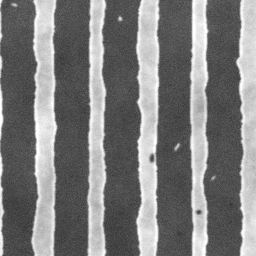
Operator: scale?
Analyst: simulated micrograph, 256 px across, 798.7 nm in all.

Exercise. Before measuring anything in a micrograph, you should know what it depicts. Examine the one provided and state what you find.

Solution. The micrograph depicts lines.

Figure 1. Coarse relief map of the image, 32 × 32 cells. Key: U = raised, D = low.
DDDDUUUDDDDUUDDDDDUUDDDDUUDDDDUU
DDDDDUUDDDDUUDDDDUUUDDDDUUDDDDUU
DDDDUUUDDDDUUDDDDUUUDDDDUUDDDDUU
DDDDUUUDDDDUUDDDDUUUDDDDUUDDDDUU
DDDDUUUDDDDUUDDDDUUUDDDDUUDDDDUU
DDDDUUUDDDDUUDDDDUUUDDDDUUDDDDUU
DDDDUUUDDDDUUDDDDUUUDDDDUUDDDDUU
DDDDDUUDDDDUUDDDDUUUDDDDUUDDDDUU
DDDDDUUDDDDUUDDDDUUUDDDDUUDDDDUU
DDDDUUUDDDDUUDDDDUUUDDDDUUDDDDUU
DDDDDUUDDDDUUDDDDUUUDDDDUUDDDDUU
DDDDDUUDDDDUUDDDDDUUDDDDUUDDDDUU
DDDDUUUDDDDUUDDDDUUUDDDDUUDDDDUU
DDDDUUUDDDDUUDDDDUUUDDDDUUDDDDUU
DDDDUUUDDDDUUDDDDDUUDDDDUUDDDDUU
DDDDDUUDDDDUUDDDDDUUDDDDUUDDDDUU
DDDDDUUDDDDUUDDDDDUUDDDDUUDDDDUU
DDDDDUUDDDDUUDDDDUUUDDDDUUDDDDUU
DDDDDUUDDDDUUDDDDUUUDDDDUUDDDDUU
DDDDDUUDDDDUUDDDDUUDDDDDUUDDDDUU
DDDDDUUDDDDUUDDDDUUUDDDDUUDDDDUU
DDDDUUUDDDDUUDDDDUUUDDDDUUDDDDUU
DDDDDUUDDDDUUDDDDDUUDDDDUDDDDDUU
DDDDDUUDDDDUUDDDDDUUDDDDUDDDDDUU
DDDDDUUDDDDUUDDDDDUUDDDDUUDDDDUU
DDDDDUUDDDDUUDDDDDUUDDDDUUDDDDUU
DDDDDUUDDDDUUDDDDUUUDDDDUUDDDDUU
DDDDUUUDDDDUUDDDDUUUDDDDUUDDDDUU
DDDDUUUDDDDUUDDDDUUUDDDDUUDDDDUU
DDDDUUUDDDDUUDDDDUUUDDDDUUDDDDUU
DDDDUUUDDDDUUDDDDUUUDDDDUUDDDDUU
DDDDUUUDDDDUUDDDDDUUDDDDUUDDDDUU